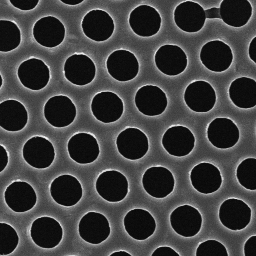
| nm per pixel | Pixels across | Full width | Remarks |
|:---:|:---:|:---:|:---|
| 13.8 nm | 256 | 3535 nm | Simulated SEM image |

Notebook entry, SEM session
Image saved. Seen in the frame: a regular array of holes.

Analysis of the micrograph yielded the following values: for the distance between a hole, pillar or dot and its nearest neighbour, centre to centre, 618 nm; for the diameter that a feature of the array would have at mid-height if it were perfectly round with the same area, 435 nm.